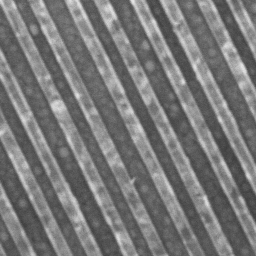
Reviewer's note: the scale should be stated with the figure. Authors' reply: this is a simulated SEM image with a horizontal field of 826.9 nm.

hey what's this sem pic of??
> parallel lines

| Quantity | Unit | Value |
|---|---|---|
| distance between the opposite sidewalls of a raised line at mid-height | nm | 41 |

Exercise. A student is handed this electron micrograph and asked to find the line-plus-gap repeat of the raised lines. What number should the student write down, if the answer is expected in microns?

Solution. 0.096